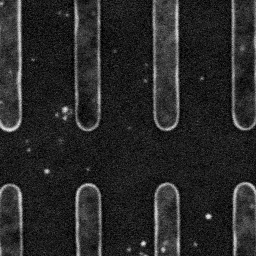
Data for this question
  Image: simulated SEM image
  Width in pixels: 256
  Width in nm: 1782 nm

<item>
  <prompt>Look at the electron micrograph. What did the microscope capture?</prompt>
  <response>groups of lines, slits or small figures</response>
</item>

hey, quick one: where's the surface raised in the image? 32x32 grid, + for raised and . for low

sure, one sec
++.......+++.......+++.......+++
++.......+++.......+++.......+++
++........++.......+++.......+++
++.......+++.......+++.......+++
++.......+++.......+++.......+++
+++......+++.......+++.......+++
+++......+++.......+++.......+++
+++......+++.......+++.......+++
+++......+++.......+++.......+++
++.......+++.......+++.......+++
++.......+++.......+++.......+++
+++......+++.......+++.......+++
+++.......++.......+++.......+++
+++......+++.......+++.......+++
+++......+++.......+++.......+++
++........++........++........++
................................
................................
................................
................................
................................
................................
................................
++........++........++........++
+++.......++.......+++.......+++
+++.......++.......+++.......+++
+++.......++.......+++.......+++
+++.......+++.......++.......+++
+++.......+++.......++.......+++
+++.......+++......+++.......+++
+++.......+++......+++.......+++
+++.......++.......+++.......+++